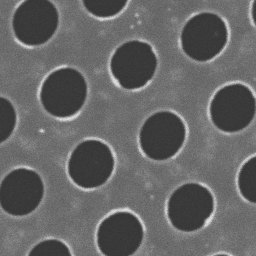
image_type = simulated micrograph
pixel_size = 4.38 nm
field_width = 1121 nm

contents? holes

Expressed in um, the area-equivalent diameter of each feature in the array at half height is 0.204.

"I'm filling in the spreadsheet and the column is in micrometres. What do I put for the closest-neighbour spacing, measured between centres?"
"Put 0.333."